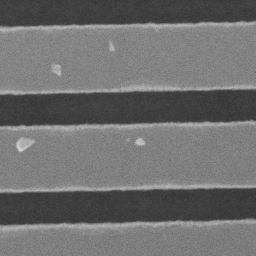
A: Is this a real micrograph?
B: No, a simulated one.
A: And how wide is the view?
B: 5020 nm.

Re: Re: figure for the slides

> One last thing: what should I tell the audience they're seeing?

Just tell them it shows lines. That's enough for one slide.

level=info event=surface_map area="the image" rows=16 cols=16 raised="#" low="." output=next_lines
................
.........#..####
################
################
################
################
................
................
################
################
################
################
................
................
################
################